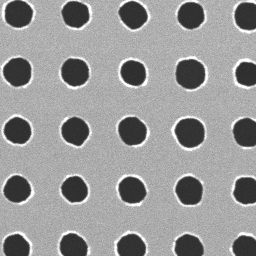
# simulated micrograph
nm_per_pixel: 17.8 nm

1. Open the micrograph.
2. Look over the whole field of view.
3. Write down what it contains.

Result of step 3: a regular array of holes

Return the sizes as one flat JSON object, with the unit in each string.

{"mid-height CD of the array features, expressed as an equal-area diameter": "0.506 µm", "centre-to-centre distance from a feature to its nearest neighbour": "1020 nm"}